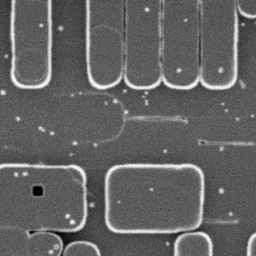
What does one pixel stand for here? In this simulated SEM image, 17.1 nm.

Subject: wiring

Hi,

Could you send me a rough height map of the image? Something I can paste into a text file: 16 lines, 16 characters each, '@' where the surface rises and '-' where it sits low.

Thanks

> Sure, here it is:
-@@---@@@@@@@@@@
-@@---@@@@@@@@@-
-@@---@@@@@@@@@-
-@@---@@@@@@@@@-
-@@---@@@@@@@@@-
----------------
----------------
----------------
----------------
----------------
@@@@@--@@@@@----
@@@@@--@@@@@@---
@@@@@--@@@@@@---
@@@@@--@@@@@@---
@@@@-------@----
@@@@@@-----@@---